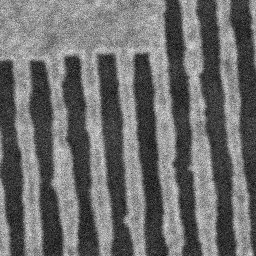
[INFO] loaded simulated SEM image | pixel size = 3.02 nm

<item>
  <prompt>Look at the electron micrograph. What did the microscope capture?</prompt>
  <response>parallel lines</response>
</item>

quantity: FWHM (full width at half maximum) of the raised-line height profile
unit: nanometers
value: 34.9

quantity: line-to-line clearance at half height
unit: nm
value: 69.8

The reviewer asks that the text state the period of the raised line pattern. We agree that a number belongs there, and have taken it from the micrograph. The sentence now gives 105 nm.